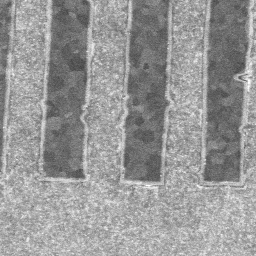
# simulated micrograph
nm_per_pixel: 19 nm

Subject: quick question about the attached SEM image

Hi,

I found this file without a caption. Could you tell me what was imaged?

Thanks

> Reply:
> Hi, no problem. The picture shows one or a few lines or trenches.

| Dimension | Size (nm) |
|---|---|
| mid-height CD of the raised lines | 802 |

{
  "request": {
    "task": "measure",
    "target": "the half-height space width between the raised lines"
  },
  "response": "37.5 px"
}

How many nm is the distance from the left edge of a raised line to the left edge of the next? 1510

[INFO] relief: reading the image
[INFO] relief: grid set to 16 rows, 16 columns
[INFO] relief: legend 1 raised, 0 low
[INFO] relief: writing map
1001110011100111
1001110011100111
1001110011100111
1001110011100111
1001110011100110
1001110011000110
0001100011100110
0001100011000110
0001100011000110
0001100011000110
0001100011000110
0000000000000000
0000000000000000
0000000000000000
0000000000000000
0000000000000000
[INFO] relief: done